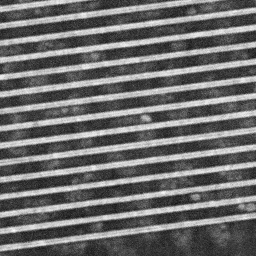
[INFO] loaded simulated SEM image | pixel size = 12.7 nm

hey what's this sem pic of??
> parallel lines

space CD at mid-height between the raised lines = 163 nanometres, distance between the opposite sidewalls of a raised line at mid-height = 47 nm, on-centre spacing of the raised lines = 214 nanometers